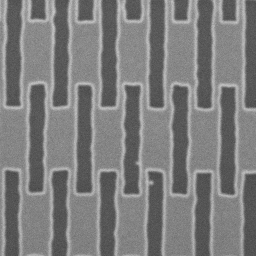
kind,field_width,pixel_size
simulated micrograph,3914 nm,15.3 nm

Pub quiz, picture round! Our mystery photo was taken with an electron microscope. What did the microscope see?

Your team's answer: groups of lines, slits or small figures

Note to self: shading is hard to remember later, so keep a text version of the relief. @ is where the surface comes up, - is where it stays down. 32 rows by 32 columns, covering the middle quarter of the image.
-@@@@@@@@----@@@@@@@@----@@@@@@@
-@@@@@@@@----@@@@@@@@----@@@@@@@
-@@@@@@@@-----@@@@@@@----@@@@@@@
-@@@@@@@@-----@@@@@@@----@@@@@@@
-@@@@@@@@-----@@@@@@@----@@@@@@@
-@@----@@-----@----@@----@@----@
-@@----@@-----@----@@----@@----@
-@@----@@-----@----@@----@@----@
-@@----@@----@@----@@----@@----@
-@@----@@----@@----@@----@@----@
-@@----@@----@@----@@----@@----@
@@@----@@@@@@@@----@@@@@@@@----@
@@@----@@@@@@@@----@@@@@@@@----@
@@@----@@@@@@@@----@@@@@@@@----@
@@@----@@@@@@@@----@@@@@@@@----@
@@@----@@@@@@@@----@@@@@@@@----@
@@@----@@@@@@@@----@@@@@@@@----@
@@@----@@@@@@@@----@@@@@@@@----@
@@@----@@@@@@@@----@@@@@@@@----@
@@@----@@@@@@@@----@@@@@@@@----@
@@@----@@@@@@@@----@@@@@@@@----@
@@@----@@@@@@@@----@@@@@@@@----@
@@@----@@@@@@@@----@@@@@@@@----@
@@@----@@@@@@@@----@@@@@@@@----@
@@@----@@@@@@@@----@@@@@@@@----@
@@@----@@@@@@@@----@@@@@@@@----@
-@@----@@@@@@@@----@@@@@@@@----@
-@@----@@----@@----@@----@@----@
-@@----@@----@@----@@----@@----@
-@@----@@----@@----@@----@@----@
-@@----@@----@@----@@----@@----@
-@@----@@----@@----@@----@@----@